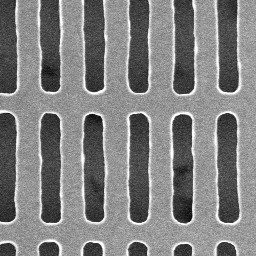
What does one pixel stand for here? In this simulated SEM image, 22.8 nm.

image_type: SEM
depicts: holes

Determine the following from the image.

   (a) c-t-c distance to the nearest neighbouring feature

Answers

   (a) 996 nm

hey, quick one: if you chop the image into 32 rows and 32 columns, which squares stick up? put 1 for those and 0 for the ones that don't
00111001110001110001110011100011
00111000110001110001110011100011
00111000110001110001110011100011
00111000110001110001110011100011
00111000110001110001110011100011
00111000110001110001110011100011
00111000110001110001110011100011
00111000111001110001110011100011
00111000111001110001110011100011
00111000111001110001110011100011
00111000111001110001110011100011
00111101111011111011110011110111
11111111111111111111111111111111
11111111111111111111111111111111
00111001111011110011110011110111
00111000110001110001110011100011
00111000110001110001110011100011
00111000110001110001110011100011
00111000110001110001110011100011
00111000110001110001110011100011
00111000110001110001110011100011
00111000110001110001110011100011
00111000110001110001110011100011
00111000110001110001110011100011
00111000110001110001110011100011
00111000111001110001100011100011
00111000111001110001110011100011
00111001111001110011110011110011
11111111111111111111111111111111
11111111111111111111111111111111
00111001111011110011111111100111
00111001110001110011110011100011